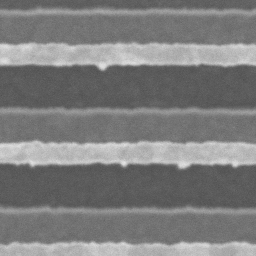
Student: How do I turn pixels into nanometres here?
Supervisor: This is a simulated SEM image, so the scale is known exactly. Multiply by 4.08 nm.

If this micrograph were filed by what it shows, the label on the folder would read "lines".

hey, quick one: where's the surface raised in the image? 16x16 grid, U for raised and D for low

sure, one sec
DDDDDDDDDDDDDDDD
UUUUUUUUUUUUUUUU
UUUUUUUUUUUUUUUU
UUUUUUUUUUUUUUUU
DDDDDDDDDDDDDDDD
DDDDDDDDDDDDDDDD
DDDDDDDDDDDDDDDD
UUUUUUUUUUUUUUUU
UUUUUUUUUUUUUUUU
UUUUUUUUUUUUUUUU
DDDDDDDDDDDDDDDD
DDDDDDDDDDDDDDDD
DDDDDDDDDDDDDDDD
UUUUUUUUUUUUUUUU
UUUUUUUUUUUUUUUU
UUUUUUUUUUUUUUUU